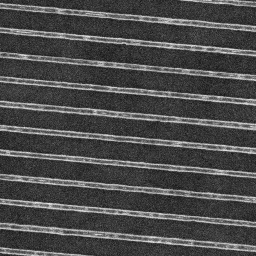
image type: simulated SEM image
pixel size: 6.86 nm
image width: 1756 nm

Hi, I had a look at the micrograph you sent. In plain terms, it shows parallel lines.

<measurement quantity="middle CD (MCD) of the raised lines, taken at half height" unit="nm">29.9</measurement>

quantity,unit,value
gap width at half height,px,19.9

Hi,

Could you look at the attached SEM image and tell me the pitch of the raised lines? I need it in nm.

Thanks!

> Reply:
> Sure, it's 167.